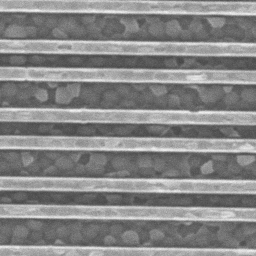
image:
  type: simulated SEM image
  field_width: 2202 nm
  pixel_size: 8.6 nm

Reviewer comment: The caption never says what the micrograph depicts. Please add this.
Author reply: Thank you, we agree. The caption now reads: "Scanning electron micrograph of parallel lines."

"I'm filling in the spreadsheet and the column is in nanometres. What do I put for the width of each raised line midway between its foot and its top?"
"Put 105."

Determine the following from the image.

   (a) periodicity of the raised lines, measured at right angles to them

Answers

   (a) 291 nm